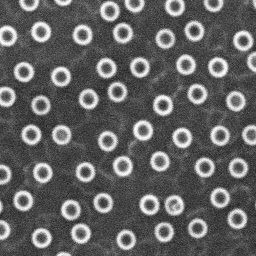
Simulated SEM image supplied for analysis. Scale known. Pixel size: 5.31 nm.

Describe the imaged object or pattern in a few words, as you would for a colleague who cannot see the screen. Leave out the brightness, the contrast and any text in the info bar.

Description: a regular array of raised bodies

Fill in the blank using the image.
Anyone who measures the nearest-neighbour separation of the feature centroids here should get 171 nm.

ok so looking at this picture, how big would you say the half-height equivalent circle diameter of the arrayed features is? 90.6 nanometres